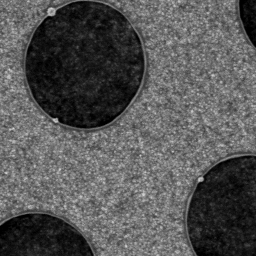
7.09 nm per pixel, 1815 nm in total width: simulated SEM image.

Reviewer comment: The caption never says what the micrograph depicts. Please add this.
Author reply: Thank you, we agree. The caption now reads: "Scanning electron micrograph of holes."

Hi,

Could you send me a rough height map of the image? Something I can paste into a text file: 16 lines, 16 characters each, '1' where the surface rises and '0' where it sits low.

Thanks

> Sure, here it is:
1111000111111110
1110000011111110
1100000001111111
1100000001111111
1100000001111111
1100000001111111
1100000011111111
1111000111111111
1111111111111111
1111111111111111
1111111111111000
1111111111110000
1111111111110000
1001111111110000
0000011111110000
0000001111110000